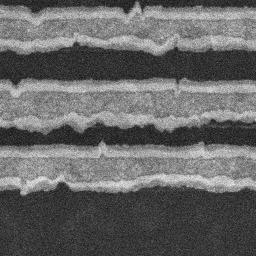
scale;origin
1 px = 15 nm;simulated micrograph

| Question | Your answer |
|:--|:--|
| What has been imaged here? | one or a few lines or trenches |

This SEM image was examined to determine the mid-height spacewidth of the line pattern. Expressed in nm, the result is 597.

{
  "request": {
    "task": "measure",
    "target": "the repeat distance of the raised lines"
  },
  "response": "1040 nm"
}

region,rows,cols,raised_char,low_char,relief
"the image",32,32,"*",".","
................................
................................
****.***************************
********************************
********************************
..**...............**...........
................................
................................
................................
................................
................................
********************************
********************************
********************************
*************************.......
................................
................................
................................
................................
********************************
********************************
********************************
*****.*.**********........******
................................
................................
................................
................................
................................
................................
................................
................................
................................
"